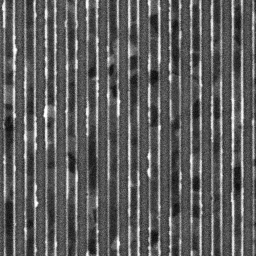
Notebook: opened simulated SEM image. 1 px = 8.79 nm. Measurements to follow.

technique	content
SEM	parallel lines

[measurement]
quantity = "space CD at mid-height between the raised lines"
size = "92.3 nanometers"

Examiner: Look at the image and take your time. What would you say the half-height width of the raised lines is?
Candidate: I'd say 0.0923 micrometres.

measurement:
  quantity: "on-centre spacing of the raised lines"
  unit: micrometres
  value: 0.182